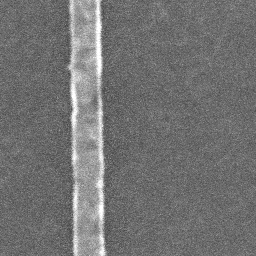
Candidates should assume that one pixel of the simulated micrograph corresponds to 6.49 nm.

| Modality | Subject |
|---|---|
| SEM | one or a few lines or trenches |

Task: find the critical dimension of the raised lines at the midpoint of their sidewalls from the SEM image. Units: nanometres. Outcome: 182